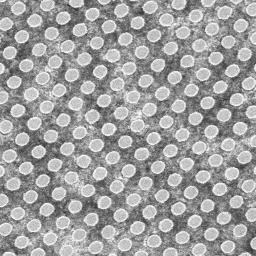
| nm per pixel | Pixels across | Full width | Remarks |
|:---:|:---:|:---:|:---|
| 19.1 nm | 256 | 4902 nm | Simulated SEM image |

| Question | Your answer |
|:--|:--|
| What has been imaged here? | a regular array of raised bodies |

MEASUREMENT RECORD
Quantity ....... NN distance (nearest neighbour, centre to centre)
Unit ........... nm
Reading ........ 385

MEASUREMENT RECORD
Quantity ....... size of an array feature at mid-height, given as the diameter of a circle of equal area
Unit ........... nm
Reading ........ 245